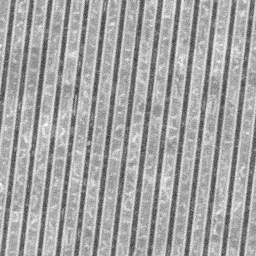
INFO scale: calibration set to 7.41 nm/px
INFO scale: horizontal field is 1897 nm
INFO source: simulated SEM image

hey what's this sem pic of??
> parallel lines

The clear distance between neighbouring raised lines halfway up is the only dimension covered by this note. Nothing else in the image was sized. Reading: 0.0478 µm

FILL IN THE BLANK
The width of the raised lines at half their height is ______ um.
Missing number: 0.0883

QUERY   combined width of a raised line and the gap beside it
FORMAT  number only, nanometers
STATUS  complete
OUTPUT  136